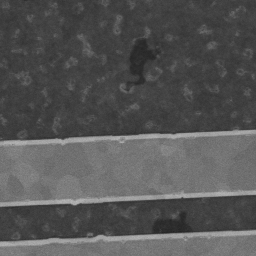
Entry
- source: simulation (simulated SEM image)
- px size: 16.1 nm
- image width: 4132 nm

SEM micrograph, one or a few lines or trenches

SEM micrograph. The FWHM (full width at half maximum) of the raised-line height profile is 991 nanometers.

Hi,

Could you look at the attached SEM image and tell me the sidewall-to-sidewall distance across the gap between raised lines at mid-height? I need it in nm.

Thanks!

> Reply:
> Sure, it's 635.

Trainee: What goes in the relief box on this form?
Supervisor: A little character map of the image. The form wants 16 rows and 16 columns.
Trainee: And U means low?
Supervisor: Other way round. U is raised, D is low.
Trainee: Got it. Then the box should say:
DDDDDDDDDDDDDDDD
DDDDDDDDDDDDDDDD
DDDDDDDDDDDDDDDD
DDDDDDDDDDDDDDDD
DDDDDDDDDDDDDDDD
DDDDDDDDDDDDDDDD
DDDDDDDDDDDDDDDD
DDDDDDDDDDDDDDDD
DDDDDDDDDDDUUUUU
UUUUUUUUUUUUUUUU
UUUUUUUUUUUUUUUU
UUUUUUUUUUUUUUUU
UUUUUUDDDDDDDDDD
DDDDDDDDDDDDDDDD
DDDDDDDDDDDDDDDD
UUUUUUUUUUUUUUUU